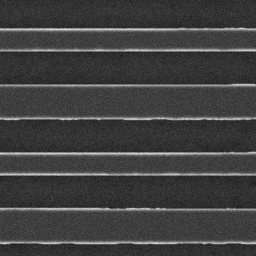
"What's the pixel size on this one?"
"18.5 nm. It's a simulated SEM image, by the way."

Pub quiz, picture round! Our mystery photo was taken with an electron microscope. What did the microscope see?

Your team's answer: lines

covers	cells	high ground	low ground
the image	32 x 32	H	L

LLLLLLLLLLLLLLLLLLLLLLLLLLLLLLLL
LLLLLLLLLLLLLLLLLLLLLLLLLLLLLLLL
LLLLLLLLLLLLLLLLLLLLLLLLLLLLLLLL
LLLLLLLLLLLLLLLLLLLLLLLLLLLLLLLL
HHHHHHHHHHHHHHHHHHHHHHHHHHHHHHHH
HHHHHHHHHHHHHHHHHHHHHHHHHHHHHHHH
LLLLLLLLLLLLLLLLLLLLLLLLLLLLLLLL
LLLLLLLLLLLLLLLLLLLLLLLLLLLLLLLL
LLLLLLLLLLLLLLLLLLLLLLLLLLLLLLLL
LLLLLLLLLLLLLLLLLLLLLLLLLLLLLLLL
LLLLLLLLLLLLLLLLLLLLLLLLLLLLLLLL
HHHHHHHHHHHHHHHHHHHHHHHHHHHHHHHH
HHHHHHHHHHHHHHHHHHHHHHHHHHHHHHHH
HHHHHHHHHHHHHHHHHHHHHHHHHHHHHHHH
HHHHHHHHHHHHHHHHHHHHHHHHHHHHHHHH
LLLLLLLLLLLLLLLLLLLLLLLLLLLLLLLL
LLLLLLLLLLLLLLLLLLLLLLLLLLLLLLLL
LLLLLLLLLLLLLLLLLLLLLLLLLLLLLLLL
LLLLLLLLLLLLLLLLLLLLLLLLLLLLLLLL
HHHHHHHHHHHHHHHHHHHHHHHHHHHHHHHH
HHHHHHHHHHHHHHHHHHHHHHHHHHHHHHHH
HHHHHHHHHHHHHHHHHHHHHHHHHHHHHHHH
LLLLLLLLLLLLLLLLLLLLLLLLLLLLLLLL
LLLLLLLLLLLLLLLLLLLLLLLLLLLLLLLL
LLLLLLLLLLLLLLLLLLLLLLLLLLLLLLLL
LLLLLLLLLLLLLLLLLLLLLLLLLLLLLLLL
HHHHHHHHHHHHHHHHHHHHHHHHHHHHHHHH
HHHHHHHHHHHHHHHHHHHHHHHHHHHHHHHH
HHHHHHHHHHHHHHHHHHHHHHHHHHHHHHHH
HHHHHHHHHHHHHHHHHHHHHHHHHHHHHHHH
LLLLLLLLLLLLLLLLLLLLLLLLLLLLLLLL
LLLLLLLLLLLLLLLLLLLLLLLLLLLLLLLL